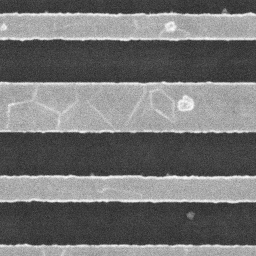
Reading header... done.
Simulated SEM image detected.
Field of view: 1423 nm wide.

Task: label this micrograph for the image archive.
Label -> lines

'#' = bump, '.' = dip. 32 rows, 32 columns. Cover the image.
................................
................................
################################
################################
################################
................................
................................
................................
................................
................................
################################
################################
################################
################################
################################
################################
...#.#....#.##..#..#..####.###..
................................
................................
................................
................................
................................
################################
################################
################################
................................
................................
................................
................................
................................
................................
################################